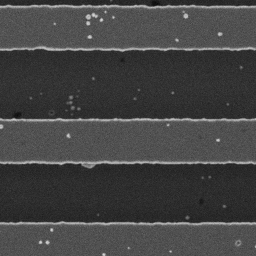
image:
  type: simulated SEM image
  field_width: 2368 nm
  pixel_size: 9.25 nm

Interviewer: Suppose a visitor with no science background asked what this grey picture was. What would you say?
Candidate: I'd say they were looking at lines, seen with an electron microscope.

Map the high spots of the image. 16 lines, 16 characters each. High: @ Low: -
@@@@@@@@@@@@@@@@
@@@@@@@@@@@@@@@@
@@@@@@@@@@@@@@@@
----------------
----------------
----------------
----------------
@@@@@@@@@@@@@@@@
@@@@@@@@@@@@@@@@
@@@@@@@@@@@@@@@@
----------------
----------------
----------------
----------------
@@@@@@@@@@@@@@@@
@@@@@@@@@@@@@@@@